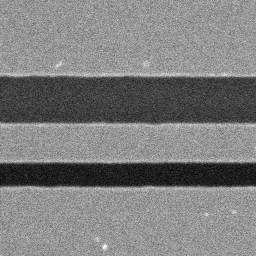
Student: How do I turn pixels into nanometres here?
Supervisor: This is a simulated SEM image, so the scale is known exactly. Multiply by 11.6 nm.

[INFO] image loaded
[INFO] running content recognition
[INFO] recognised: lines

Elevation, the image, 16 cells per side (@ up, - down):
@@@@@@@@@@@@@@@@
@@@@@@@@@@@@@@@@
@@@@@@@@@@@@@@@@
@@@@@@@@@@@@@@@@
@@@@@@@@@@@@@@@@
----------------
----------------
----------------
@@@@@@@@@@@@@@@@
@@@@@@@@@@@@@@@@
----------------
----------------
@@@@@@@@@@@@@@@@
@@@@@@@@@@@@@@@@
@@@@@@@@@@@@@@@@
@@@@@@@@@@@@@@@@